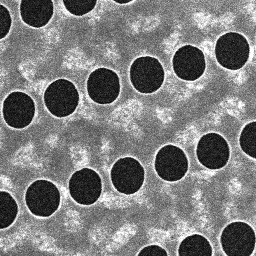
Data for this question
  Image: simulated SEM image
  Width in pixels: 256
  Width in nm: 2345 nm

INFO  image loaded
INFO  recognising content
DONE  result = a regular array of holes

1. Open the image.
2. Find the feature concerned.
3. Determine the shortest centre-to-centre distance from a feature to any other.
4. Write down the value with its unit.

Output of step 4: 400 nm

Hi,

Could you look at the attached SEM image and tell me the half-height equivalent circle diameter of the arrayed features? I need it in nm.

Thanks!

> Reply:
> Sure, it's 325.